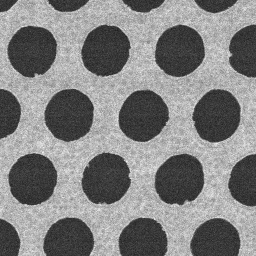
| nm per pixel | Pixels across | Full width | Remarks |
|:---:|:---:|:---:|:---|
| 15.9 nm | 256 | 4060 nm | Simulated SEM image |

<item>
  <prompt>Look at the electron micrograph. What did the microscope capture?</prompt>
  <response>a regular array of holes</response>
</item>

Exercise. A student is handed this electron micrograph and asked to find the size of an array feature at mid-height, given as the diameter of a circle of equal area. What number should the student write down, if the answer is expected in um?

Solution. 0.803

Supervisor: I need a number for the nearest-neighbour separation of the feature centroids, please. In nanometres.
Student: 1170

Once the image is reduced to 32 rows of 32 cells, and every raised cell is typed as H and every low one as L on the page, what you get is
LLHHHHLLLLLHHHHHLLLLHHHHHLLLLHHH
HHHHHHHHLHHHHHHHHHHHHHHHHHLLHHHH
HHHHHHHHHHHHHHHHHHHHHHHHHHHHHHHH
HHHLLHHHHHHHLLLHHHHHHLLLHHHHHHLL
HHLLLLLHHHHLLLLLHHHHLLLLLHHHHLLL
HLLLLLLHHHLLLLLLHHHHLLLLLHHHHLLL
HLLLLLLHHHLLLLLLHHHLLLLLLLHHHLLL
HLLLLLLHHHLLLLLLHHHLLLLLLHHHHLLL
HHLLLLHHHHHLLLLHHHHHLLLLLHHHHLLL
HHHLHHHHHHHHHHHHHHHHHLLHHHHHHHHL
HHHHHHHHHHHHHHHHHHHHHHHHHHHHHHHH
LHHHHHHLLLHHHHHHHLLHHHHHHHLLLHHH
LLHHHHLLLLLHHHHHLLLLHHHHHLLLLLHH
LLLHHHLLLLLLHHHLLLLLLHHHLLLLLLHH
LLLHHHLLLLLLHHHLLLLLLHHHLLLLLLHH
LLHHHHLLLLLLHHHLLLLLLHHHLLLLLLHH
LLHHHHLLLLLHHHHLLLLLHHHHHLLLLHHH
HHHHHHHHLLHHHHHHHLLHHHHHHHLLHHHH
HHHHHHHHHHHHHHHHHHHHHHHHHHHHHHHH
HHHLLHHHHHHHLLLHHHHHHHLLHHHHHHHL
HHLLLLLHHHHLLLLLHHHHLLLLLHHHHHLL
HLLLLLLHHHLLLLLLHHHHLLLLLHHHHLLL
HLLLLLLHHHLLLLLLHHHLLLLLLHHHHLLL
HLLLLLLHHHLLLLLLHHHLLLLLLHHHHLLL
HHLLLLHHHHHLLLLHHHHHLLLLLHHHHLLL
HHHLLHHHHHHHHHHHHHHHHLLHHHHHHHLL
HHHHHHHHHHHHHHHHHHHHHHHHHHHHHHHH
HHHHHHHLLLHHHHHHHLLHHHHHHHLLHHHH
LLHHHHLLLLLHHHHHLLLLHHHHHLLLLHHH
LLHHHHLLLLLLHHHLLLLLLHHHLLLLLLHH
LLLHHLLLLLLLHHHLLLLLLHHHLLLLLLHH
LLHHHHLLLLLHHHHLLLLLLHHHLLLLLLHH